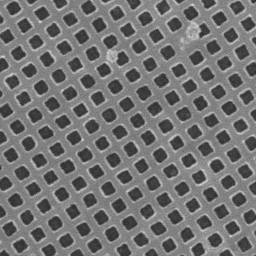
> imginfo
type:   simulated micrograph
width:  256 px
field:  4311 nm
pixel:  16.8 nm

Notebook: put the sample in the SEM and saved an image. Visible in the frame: a regular array of holes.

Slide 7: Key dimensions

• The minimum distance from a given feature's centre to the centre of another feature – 336 nanometres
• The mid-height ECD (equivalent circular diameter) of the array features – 14.3 px